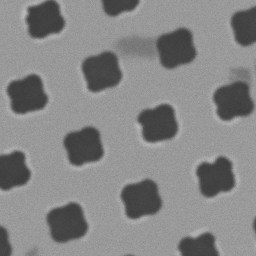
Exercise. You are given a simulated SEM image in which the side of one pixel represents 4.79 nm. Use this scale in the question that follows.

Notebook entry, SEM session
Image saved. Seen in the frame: a regular array of holes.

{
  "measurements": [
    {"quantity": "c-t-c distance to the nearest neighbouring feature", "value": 370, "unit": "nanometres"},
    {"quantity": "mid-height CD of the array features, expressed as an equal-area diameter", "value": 187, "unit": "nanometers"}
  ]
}